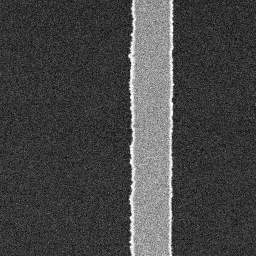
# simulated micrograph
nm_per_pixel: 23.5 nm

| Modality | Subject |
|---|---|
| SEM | one or a few lines or trenches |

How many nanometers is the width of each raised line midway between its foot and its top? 906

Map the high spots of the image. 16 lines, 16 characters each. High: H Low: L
LLLLLLLLHHHLLLLL
LLLLLLLLHHHLLLLL
LLLLLLLLHHHLLLLL
LLLLLLLLHHHLLLLL
LLLLLLLLHHHLLLLL
LLLLLLLLHHHLLLLL
LLLLLLLLHHHLLLLL
LLLLLLLLHHHLLLLL
LLLLLLLLHHHLLLLL
LLLLLLLLHHHLLLLL
LLLLLLLLHHHLLLLL
LLLLLLLLHHHLLLLL
LLLLLLLLHHHLLLLL
LLLLLLLLHHHLLLLL
LLLLLLLLHHHLLLLL
LLLLLLLLHHHLLLLL